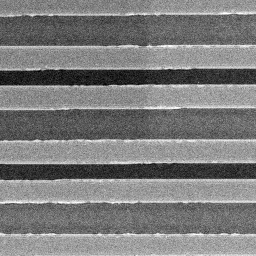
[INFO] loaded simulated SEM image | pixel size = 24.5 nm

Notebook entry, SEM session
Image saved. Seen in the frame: lines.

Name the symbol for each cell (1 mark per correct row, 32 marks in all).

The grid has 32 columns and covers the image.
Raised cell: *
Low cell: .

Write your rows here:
********************************
********************************
................................
................................
................................
................................
********************************
********************************
************************........
................................
................................
********************************
********************************
***********************.........
................................
................................
................................
................................
********************************
********************************
................................
................................
****..**************************
********************************
********************************
................................
................................
................................
................................
********************************
********************************
********************************